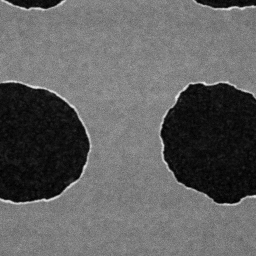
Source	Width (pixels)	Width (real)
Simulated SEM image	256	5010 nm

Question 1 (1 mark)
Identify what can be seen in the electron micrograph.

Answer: holes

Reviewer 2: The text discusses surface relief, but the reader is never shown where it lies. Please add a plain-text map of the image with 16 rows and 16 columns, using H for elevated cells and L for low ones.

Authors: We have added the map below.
HLLHHHHHHHHHHLHH
HHHHHHHHHHHHHHHH
HHHHHHHHHHHHHHHH
HHHHHHHHHHHHHHHH
HHHHHHHHHHHHHHHH
LLHHHHHHHHHHLLLH
LLLLHHHHHHHLLLLL
LLLLLHHHHHLLLLLL
LLLLLLHHHHLLLLLL
LLLLLLHHHHLLLLLL
LLLLLHHHHHHLLLLL
LLLLLHHHHHHLLLLL
LLLHHHHHHHHHHLLH
HHHHHHHHHHHHHHHH
HHHHHHHHHHHHHHHH
HHHHHHHHHHHHHHHH